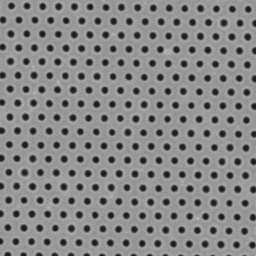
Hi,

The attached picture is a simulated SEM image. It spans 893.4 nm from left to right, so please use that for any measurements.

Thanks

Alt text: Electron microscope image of a regular array of holes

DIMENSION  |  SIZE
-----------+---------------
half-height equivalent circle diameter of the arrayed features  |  0.0219 µm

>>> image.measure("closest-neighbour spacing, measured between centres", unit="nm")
54.4